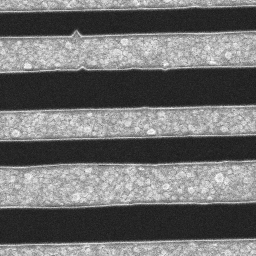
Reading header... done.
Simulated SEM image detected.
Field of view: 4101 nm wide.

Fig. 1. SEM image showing one or a few lines or trenches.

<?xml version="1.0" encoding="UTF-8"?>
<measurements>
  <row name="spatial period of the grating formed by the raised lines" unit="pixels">67.3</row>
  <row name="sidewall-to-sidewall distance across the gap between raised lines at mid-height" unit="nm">527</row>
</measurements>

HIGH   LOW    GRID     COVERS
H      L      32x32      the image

LLLLLLLLLLLLLLLLLLLLLLLLLLLLLLLL
HHHHHHHHHHHHHHHHHHHHHHHHHHHHHHHH
HHHHHHHHHHHHHHHHHHHHHHHHHHHHHHHH
HHHHHHHHHHHHHHHHHHHHHHHHHHHHHHHH
HHHHHHHHHLHHLLLHLLLLLLLLLLLLLLLL
LLLLLLLLLLLLLLLHLLLLLLLLLLLLLLLL
LLLLLLLLLLLLLLLLLLLLLLLLLLLLLLLL
LLLLLLLLLLLLLLLLLLLLLLLLLLLLLLLL
LLLHLLLLLLLLLLLLLHLLLHHHHHHHHHHH
HHHHHHHHHHHHHHHHHHHHHHHHHHHHHHHH
HHHHHHHHHHHHHHHHHHHHHHHHHHHHHHHH
HHHHHHHHHHHHHHHHHHHHHHHHHHHHHHHH
HHHHHHHHHHHHHHHHHHHHHHHHHHHHHHHH
HHHHHHHHHHHHHHHHHHHHHLLLHLLLLLLL
LLLLLLLLLLLLLLLLLLLLLLLLLLLLLLLL
LLLLLLLLLLLLLLLLLLLLLLLLLLLLLLLL
LLLLLLLLLLLLLLLLLLLLLLLLLLLLLLLL
LHHLHHHHHHHHHHHHHHHHHHHHHHHHHHHH
HHHHHHHHHHHHHHHHHHHHHHHHHHHHHHHH
HHHHHHHHHHHHHHHHHHHHHHHHHHHHHHHH
HHHHHHHHHHLHHHHHHHHHHHLLLLLLLLLL
LLLLLLLLLLLLLLLLLLLLLLLLLLLLLLLL
LLLLLLLLLLLLLLLLLLLLLLLLLLLHLLLL
LLLLLLLLLLLLLLLLLLLLLLLLLLLLLLLL
LLLLLLLLLHLLLLLLLLLLLLLLLLLLLLLL
LLLLLLLLLLLLLLLLHHHHHHHHHHHHHHHH
HHHHHHHHHHHHHHHHHHHHHHHHHHHHHHHH
HHHHHHHHHHHHHHHHHHHHHHHHHHHHHHHH
HHHHHHHHHHHHHHHHHHHHHHHHHHHHHHHH
HHHHHHHHHHHHHHHHHHHHHHHHHHHHHHHH
HHHHHHHHLLLLLLLLLLLLLLLLLLLLLLLL
LLLLLLLLLLLLLLLLLLLLLLLLLLLLLLLL